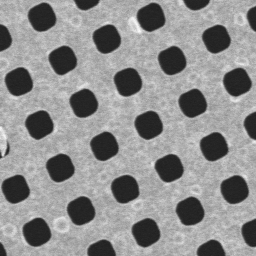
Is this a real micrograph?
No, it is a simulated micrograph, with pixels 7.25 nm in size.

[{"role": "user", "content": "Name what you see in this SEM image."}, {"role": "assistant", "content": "a regular array of holes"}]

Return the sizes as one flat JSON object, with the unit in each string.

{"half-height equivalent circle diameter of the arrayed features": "206 nanometres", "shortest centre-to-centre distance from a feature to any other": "346 nanometres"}